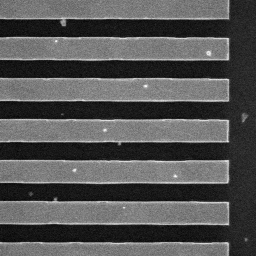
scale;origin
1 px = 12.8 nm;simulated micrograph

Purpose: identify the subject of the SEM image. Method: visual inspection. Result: wiring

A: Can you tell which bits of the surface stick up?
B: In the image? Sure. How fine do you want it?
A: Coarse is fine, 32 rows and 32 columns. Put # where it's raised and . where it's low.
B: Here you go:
#############################...
#############################...
................................
................................
................................
#############################...
#############################...
................................
................................
................................
#############################...
#############################...
############################....
................................
................................
#############################...
#############################...
############################....
................................
................................
#############################...
#############################...
#############################...
................................
................................
############################....
#############################...
#############################...
................................
................................
############################....
#############################...